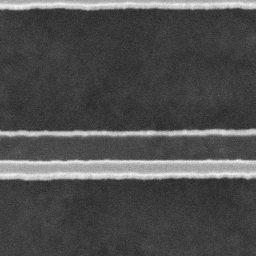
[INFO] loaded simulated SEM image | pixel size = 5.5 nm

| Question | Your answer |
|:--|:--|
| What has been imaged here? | lines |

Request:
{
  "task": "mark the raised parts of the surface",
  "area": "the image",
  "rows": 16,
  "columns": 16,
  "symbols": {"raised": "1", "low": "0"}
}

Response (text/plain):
0000000000000000
0000000000000000
0000000000000000
0000000000000000
0000000000000000
0000000000000000
0000000000000000
0000000000000000
1111111111111111
1111111111111111
1111111111111111
0000000000000000
0000000000000000
0000000000000000
0000000000000000
0000000000000000